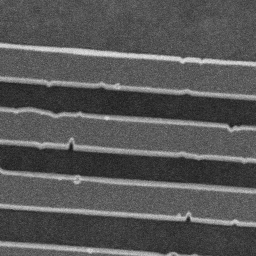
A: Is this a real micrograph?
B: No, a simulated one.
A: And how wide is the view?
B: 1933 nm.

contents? one or a few lines or trenches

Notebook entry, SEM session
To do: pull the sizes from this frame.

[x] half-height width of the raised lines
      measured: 35.1 pixels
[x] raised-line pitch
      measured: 476 nm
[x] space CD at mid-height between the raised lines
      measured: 0.213 microns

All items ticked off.